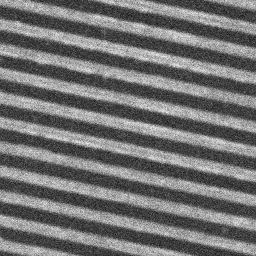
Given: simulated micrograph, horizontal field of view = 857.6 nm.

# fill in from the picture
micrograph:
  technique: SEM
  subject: parallel lines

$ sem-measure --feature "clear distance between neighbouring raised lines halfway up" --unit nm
50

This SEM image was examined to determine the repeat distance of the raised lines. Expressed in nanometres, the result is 80.3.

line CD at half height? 32 nanometers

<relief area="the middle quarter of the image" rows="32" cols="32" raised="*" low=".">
*********..................*****
...***********..................
.........**********.............
.............************.......
..................**********....
****...................*********
*********...................****
....**********..................
.......************.............
.............**********.........
..................**********....
****..................**********
********...................*****
..************..................
.......***********..............
............***********.........
.................***********....
***..................**********.
********..................******
..**********...................*
......***********...............
............**********..........
................**********......
***..................**********.
*******..................*******
..**********..................**
.......**********...............
...........***********..........
................**********......
**...................**********.
*******.................********
.***********.................***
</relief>